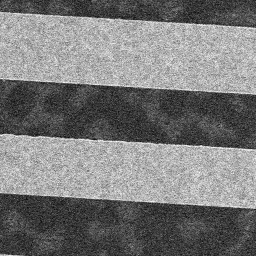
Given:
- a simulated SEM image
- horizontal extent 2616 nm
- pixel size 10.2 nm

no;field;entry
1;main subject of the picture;one or a few lines or trenches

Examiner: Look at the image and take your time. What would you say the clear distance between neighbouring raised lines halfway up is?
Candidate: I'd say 0.573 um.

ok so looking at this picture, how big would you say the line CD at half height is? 636 nm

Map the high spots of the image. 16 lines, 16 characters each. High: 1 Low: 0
0000000000000000
1111111111110000
1111111111111111
1111111111111111
1111111111111111
0000000000111111
0000000000000000
0000000000000000
1000000000000000
1111111111111111
1111111111111111
1111111111111111
0000000111111111
0000000000000000
0000000000000000
0000000000000000